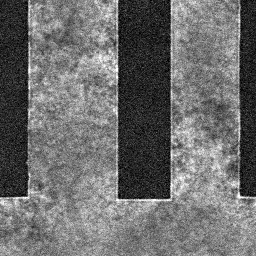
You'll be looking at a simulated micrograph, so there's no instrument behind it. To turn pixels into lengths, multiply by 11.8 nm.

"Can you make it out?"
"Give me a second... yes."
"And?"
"one or a few lines or trenches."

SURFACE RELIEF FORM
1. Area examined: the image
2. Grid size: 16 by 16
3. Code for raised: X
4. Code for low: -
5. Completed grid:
--XXXXX----XXXX-
--XXXXX----XXXX-
--XXXXX----XXXX-
--XXXXX----XXXX-
--XXXXX----XXXX-
--XXXXX----XXXX-
--XXXXX----XXXX-
--XXXXX----XXXX-
--XXXXX----XXXX-
--XXXXX----XXXX-
--XXXXX----XXXX-
--XXXXX----XXXX-
XXXXXXXX--XXXXXX
XXXXXXXXXXXXXXXX
XXXXXXXXXXXXXXXX
XXXXXXXXXXXXXXXX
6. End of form